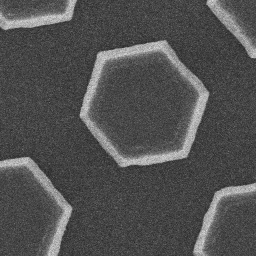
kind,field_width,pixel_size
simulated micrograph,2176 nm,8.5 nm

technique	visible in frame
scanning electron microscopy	raised bodies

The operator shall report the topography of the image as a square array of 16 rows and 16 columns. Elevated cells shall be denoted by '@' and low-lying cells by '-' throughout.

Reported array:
@@@@---------@@@
@@------------@@
---------------@
-------@@@@-----
------@@@@@@----
------@@@@@@@---
-----@@@@@@@@---
-----@@@@@@@----
------@@@@@@----
-------@@@@-----
@@--------------
@@@-------------
@@@@----------@@
@@@@---------@@@
@@@@---------@@@
@@@---------@@@@